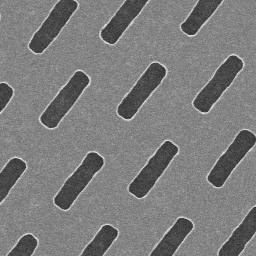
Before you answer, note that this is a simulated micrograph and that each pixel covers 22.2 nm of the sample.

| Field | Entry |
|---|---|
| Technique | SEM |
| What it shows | holes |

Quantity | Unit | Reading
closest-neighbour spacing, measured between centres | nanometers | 1710